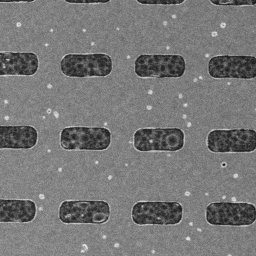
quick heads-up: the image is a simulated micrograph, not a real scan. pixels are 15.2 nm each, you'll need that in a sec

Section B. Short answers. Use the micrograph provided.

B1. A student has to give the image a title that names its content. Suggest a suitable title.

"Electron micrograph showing holes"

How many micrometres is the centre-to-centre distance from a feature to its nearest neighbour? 1.11